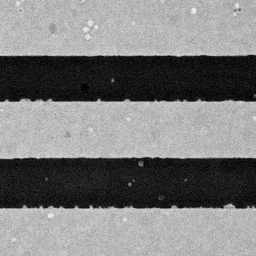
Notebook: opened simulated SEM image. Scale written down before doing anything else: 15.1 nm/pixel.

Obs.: lines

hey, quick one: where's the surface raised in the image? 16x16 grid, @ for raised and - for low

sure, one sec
@@@@@@@@@@@@@@@@
@@@@@@@@@@@@@@@@
@@@@@@@@@@@@@@@@
-----------@----
----------------
----------------
@@@@@@@@@@@@@@@@
@@@@@@@@@@@@@@@@
@@@@@@@@@@@@@@@@
@@@@@@@@@@@@@@@@
----------------
----------------
----------------
@@@@@@@@@@@@@@@@
@@@@@@@@@@@@@@@@
@@@@@@@@@@@@@@@@